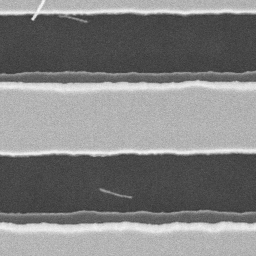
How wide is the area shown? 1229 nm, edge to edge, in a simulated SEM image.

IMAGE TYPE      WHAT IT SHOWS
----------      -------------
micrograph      lines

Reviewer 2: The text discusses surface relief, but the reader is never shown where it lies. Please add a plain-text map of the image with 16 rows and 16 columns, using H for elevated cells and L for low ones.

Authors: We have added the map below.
HHHHHHHHHHHHHHHH
LLLLLLLLLLLLLLLL
LLLLLLLLLLLLLLLL
LLLLLLLLLLLLLLLL
LLLLLLLLLLLLLLLL
HHHHHHHHHHHHHHHH
HHHHHHHHHHHHHHHH
HHHHHHHHHHHHHHHH
HHHHHHHHHHHHHHHH
HHHHHHHHHHHHHHHH
LLLLLLLLLLLLLLLL
LLLLLLLLLLLLLLLL
LLLLLLLLLLLLLLLL
LLLLLLLLLLLLLLLL
HHHHHHHHHHHHHHHH
HHHHHHHHHHHHHHHH